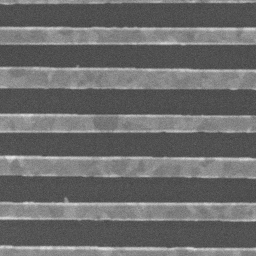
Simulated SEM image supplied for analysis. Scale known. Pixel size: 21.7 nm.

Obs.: lines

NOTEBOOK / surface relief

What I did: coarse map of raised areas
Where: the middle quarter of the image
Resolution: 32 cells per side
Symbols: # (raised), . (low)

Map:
................................
####################............
################################
################################
################################
################################
................................
................................
................................
................................
................................
................................
................................
################################
################################
################################
################################
................................
................................
................................
................................
................................
................................
................................
################################
################################
################################
################################
................................
................................
................................
................................